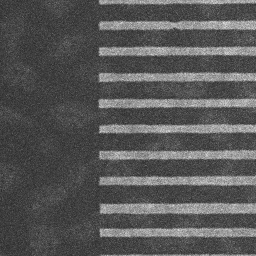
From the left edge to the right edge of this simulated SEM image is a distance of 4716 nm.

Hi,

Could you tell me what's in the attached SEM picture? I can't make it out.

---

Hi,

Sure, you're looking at parallel lines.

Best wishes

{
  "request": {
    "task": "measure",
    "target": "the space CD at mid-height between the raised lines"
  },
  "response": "0.334 microns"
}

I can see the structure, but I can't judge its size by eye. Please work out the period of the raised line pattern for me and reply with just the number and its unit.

477 nm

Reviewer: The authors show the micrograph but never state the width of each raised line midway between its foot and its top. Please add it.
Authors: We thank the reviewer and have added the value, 140 nm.